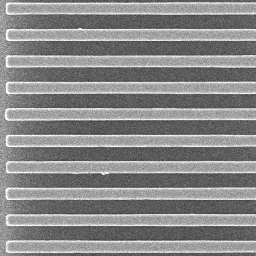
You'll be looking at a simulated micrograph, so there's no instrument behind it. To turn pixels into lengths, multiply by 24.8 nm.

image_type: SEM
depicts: parallel lines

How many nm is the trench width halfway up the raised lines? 368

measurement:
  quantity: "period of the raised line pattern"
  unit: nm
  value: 654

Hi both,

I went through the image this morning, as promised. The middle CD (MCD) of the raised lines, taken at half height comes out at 300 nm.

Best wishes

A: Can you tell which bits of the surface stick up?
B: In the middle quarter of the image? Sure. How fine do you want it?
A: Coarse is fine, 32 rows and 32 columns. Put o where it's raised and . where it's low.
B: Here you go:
oooooooooooooooooooooooooooooooo
................................
................................
................................
................................
oooooooooooooooooooooooooooooooo
oooooooooooooooooooooooooooooooo
................................
................................
................................
................................
oooooooooooooooooooooooooooooooo
oooooooooooooooooooooooooooooooo
oooooooooooooooooooooooooooooooo
................................
................................
................................
................................
oooooooooooooooooooooooooooooooo
oooooooooooooooooooooooooooooooo
oooooooooooooooooooooooooooooooo
................................
................................
................................
ooooo.........ooooo.............
oooooooooooooooooooooooooooooooo
oooooooooooooooooooooooooooooooo
................................
................................
................................
................................
oooooooooooooooooooooooooooooooo